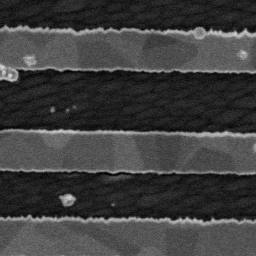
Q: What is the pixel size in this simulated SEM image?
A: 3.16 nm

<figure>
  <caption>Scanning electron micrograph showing lines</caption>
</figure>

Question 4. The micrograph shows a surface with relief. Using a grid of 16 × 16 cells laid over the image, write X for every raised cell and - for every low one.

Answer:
----------------
----------------
XXXXXXXXXXXXXXXX
XXXXXXXXXXXXXXXX
X--------X-XXXXX
----------------
----------------
----------------
XXXXXXXXXXXXXXXX
XXXXXXXXXXXXXXXX
XXXXXXXXXXXXXXXX
----------------
----------------
----------------
XXXXXXXXXXXXXXXX
XXXXXXXXXXXXXXXX